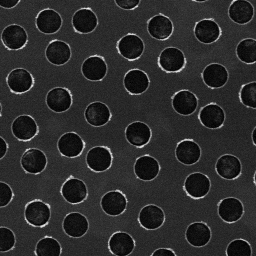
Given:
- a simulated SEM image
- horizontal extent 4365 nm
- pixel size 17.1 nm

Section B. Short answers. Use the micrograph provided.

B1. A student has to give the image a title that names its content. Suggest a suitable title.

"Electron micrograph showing a regular array of holes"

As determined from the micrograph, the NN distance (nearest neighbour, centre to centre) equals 0.603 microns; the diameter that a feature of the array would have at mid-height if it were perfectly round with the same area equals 418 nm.